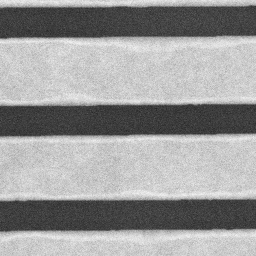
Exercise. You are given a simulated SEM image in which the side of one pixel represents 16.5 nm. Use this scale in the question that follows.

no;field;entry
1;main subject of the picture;lines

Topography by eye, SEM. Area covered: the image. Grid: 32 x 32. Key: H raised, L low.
HHHHHHHHHHHHHHHHHHHHLLLLLLLLLLLL
LLLLLLLLLLLLLLLLLLLLLLLLLLLLLLLL
LLLLLLLLLLLLLLLLLLLLLLLLLLLLLLLL
LLLLLLLLLLLLLLLLLLLLLLLLLLLLLLLL
LLLLLLLLLLLLLLLLLLLLLLLLLLLLLLLL
HHHHHHHHHHHHHHHHHHHHHHHHHHHHHHHH
HHHHHHHHHHHHHHHHHHHHHHHHHHHHHHHH
HHHHHHHHHHHHHHHHHHHHHHHHHHHHHHHH
HHHHHHHHHHHHHHHHHHHHHHHHHHHHHHHH
HHHHHHHHHHHHHHHHHHHHHHHHHHHHHHHH
HHHHHHHHHHHHHHHHHHHHHHHHHHHHHHHH
HHHHHHHHHHHHHHHHHHHHHHHHHHHHHHHH
HHHHHHHHHHHHHHHHHHHHHHHHHHHHHHHH
LLLLLLLLLLLLLLLLLLLLLLLLLLLLLLLL
LLLLLLLLLLLLLLLLLLLLLLLLLLLLLLLL
LLLLLLLLLLLLLLLLLLLLLLLLLLLLLLLL
LLLLLLLLLLLLLLLLLLLLLLLLLLLLLLLL
HHHHHHHHHHHHHHHHHHHHHHHHHHHHHHHH
HHHHHHHHHHHHHHHHHHHHHHHHHHHHHHHH
HHHHHHHHHHHHHHHHHHHHHHHHHHHHHHHH
HHHHHHHHHHHHHHHHHHHHHHHHHHHHHHHH
HHHHHHHHHHHHHHHHHHHHHHHHHHHHHHHH
HHHHHHHHHHHHHHHHHHHHHHHHHHHHHHHH
HHHHHHHHHHHHHHHHHHHHHHHHHHHHHHHH
HHHHHHHHHHHHHHHHHHHHHHHHHHHHHHHH
LLLLLLLLLLLLLLLLLLLLLLLLLLLLLLLL
LLLLLLLLLLLLLLLLLLLLLLLLLLLLLLLL
LLLLLLLLLLLLLLLLLLLLLLLLLLLLLLLL
LLLLLLLLLLLLLLLLLLLLLLLLLLLLLLLL
HHHHHHHHHHHHHHHHHHHHHHHHHHHHHHHH
HHHHHHHHHHHHHHHHHHHHHHHHHHHHHHHH
HHHHHHHHHHHHHHHHHHHHHHHHHHHHHHHH